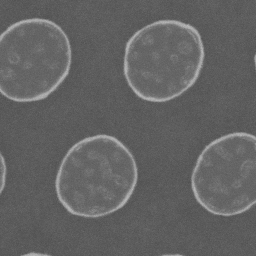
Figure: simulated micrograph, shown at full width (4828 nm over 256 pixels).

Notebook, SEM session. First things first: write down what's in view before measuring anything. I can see raised bodies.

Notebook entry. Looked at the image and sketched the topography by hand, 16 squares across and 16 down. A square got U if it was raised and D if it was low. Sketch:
DDDDDDDDDDDDDDDD
DUUDDDDDDDUDDDDD
UUUUDDDDUUUUUDDD
UUUUDDDDUUUUUDDD
UUUUDDDDUUUUDDDD
UUUDDDDDUUUUDDDD
DDDDDDDDDDDDDDDD
DDDDDDDDDDDDDDDD
DDDDDDDDDDDDDDUU
DDDDUUUUDDDDDUUU
DDDDUUUUDDDDUUUU
DDDDUUUUDDDDUUUU
DDDDUUUUDDDDUUUU
DDDDDUDDDDDDDDDD
DDDDDDDDDDDDDDDD
DDDDDDDDDDDDDDDD